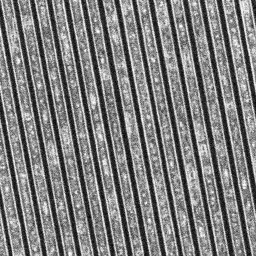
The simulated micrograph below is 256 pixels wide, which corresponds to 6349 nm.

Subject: parallel lines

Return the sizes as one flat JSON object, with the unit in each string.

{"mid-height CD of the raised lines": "0.171 micrometres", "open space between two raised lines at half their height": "244 nm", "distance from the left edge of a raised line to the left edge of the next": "416 nm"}